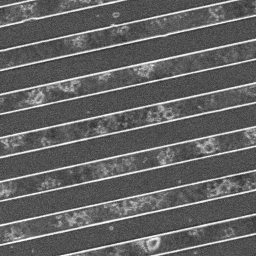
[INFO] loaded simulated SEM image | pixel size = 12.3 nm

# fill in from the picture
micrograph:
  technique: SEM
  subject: parallel lines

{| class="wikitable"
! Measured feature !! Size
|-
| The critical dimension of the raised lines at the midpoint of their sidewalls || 242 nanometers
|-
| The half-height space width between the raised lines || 291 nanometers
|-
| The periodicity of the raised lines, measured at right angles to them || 524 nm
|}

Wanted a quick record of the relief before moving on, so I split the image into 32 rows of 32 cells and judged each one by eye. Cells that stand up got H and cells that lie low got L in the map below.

LLHHHHHHHHHHHLLLLLLLLLLLLLLHHHHH
HHHHHHHHHLLLLLLLLLLLLLLHHHHHHHHH
HHHLLLLLLLLLLLLLLLHHHHHHHHHHHLLL
LLLLLLLLLLLLLHHHHHHHHHHHHLLLLLLL
LLLLLLLLLHHHHHHHHHHHLLLLLLLLLLLL
LLLLHHHHHHHHHHHLLLLLLLLLLLLLLHHH
HHHHHHHHHHHLLLLLLLLLLLLLLHHHHHHH
HHHHHHLLLLLLLLLLLLLLHHHHHHHHHHHL
HLLLLLLLLLLLLLLHHHHHHHHHHHHLLLLL
LLLLLLLLLLLHHHHHHHHHHHLLLLLLLLLL
LLLLLLHHHHHHHHHHHLLLLLLLLLLLLLLH
LLHHHHHHHHHHHLLLLLLLLLLLLLLHHHHH
HHHHHHHHLLLLLLLLLLLLLLHHHHHHHHHH
HHHLLLLLLLLLLLLLLHHHHHHHHHHHHLLL
LLLLLLLLLLLLLHHHHHHHHHHHLLLLLLLL
LLLLLLLLHHHHHHHHHHHLLLLLLLLLLLLL
LLLLHHHHHHHHHHHLLLLLLLLLLLLLLHHH
HHHHHHHHHHLLLLLLLLLLLLLLHHHHHHHH
HHHHHLLLLLLLLLLLLLLHHHHHHHHHHHHL
HLLLLLLLLLLLLLLHHHHHHHHHHHLLLLLL
LLLLLLLLLLHHHHHHHHHHHHLLLLLLLLLL
LLLLLLHHHHHHHHHHHLLLLLLLLLLLLLLH
LHHHHHHHHHHHLLLLLLLLLLLLLLLHHHHH
HHHHHHHHLLLLLLLLLLLLLLHHHHHHHHHH
HHHLLLLLLLLLLLLLLHHHHHHHHHHHHLLL
LLLLLLLLLLLLLHHHHHHHHHHHLLLLLLLL
LLLLLLLLHHHHHHHHHHHLLLLLLLLLLLLL
LLLHHHHHHHHHHHHLLLLLLLLLLLLLLHHH
HHHHHHHHHHLLLLLLLLLLLLLLHHHHHHHH
HHHHHLLLLLLLLLLLLLLHHHHHHHHHHHHL
HLLLLLLLLLLLLLLHHHHHHHHHHHLLLLLL
LLLLLLLLLLHHHHHHHHHHHLLLLLLLLLLL